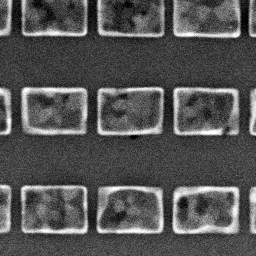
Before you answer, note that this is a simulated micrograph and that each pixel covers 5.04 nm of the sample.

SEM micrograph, wiring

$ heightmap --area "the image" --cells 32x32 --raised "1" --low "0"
10011111111011111111001111111101
10011111111011111111001111111101
10011111111011111111001111111101
10011111111011111111001111111101
00000000000000000011000000000000
00000000000000000000000000000000
00000000000000000000000000000000
00000000000000000000000000000000
00000000000000000000000000000000
00000000000000000000000000000000
00000000000000000000000000000000
10011111111011111111001111111000
10011111111011111111001111111100
10011111111011111111001111111100
10011111111011111111001111111000
10011111111011111111001111111001
10000111110001111100001111110001
00000000000000000000000000000000
00000000000000000000000000000000
00000000000000000000000000000000
00000000000000000000000000000000
00000000000000000000000000000000
00000000000000000000000000000000
10011111111000111100000000000000
10011111111001111111001111111100
10011111111001111111001111111100
10011111111011111111001111111100
10011111111011111111001111111000
10011111111011111111001111111000
00000000000000000000000000000000
00000000000000000000000000000000
00000000000000000000000000000000